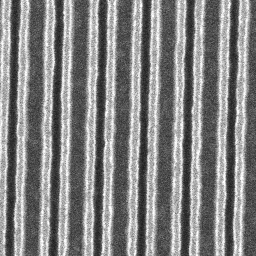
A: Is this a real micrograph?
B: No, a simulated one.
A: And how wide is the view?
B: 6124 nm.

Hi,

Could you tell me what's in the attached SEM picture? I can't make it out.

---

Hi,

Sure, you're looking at parallel lines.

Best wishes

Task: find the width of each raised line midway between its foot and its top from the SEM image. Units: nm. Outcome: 224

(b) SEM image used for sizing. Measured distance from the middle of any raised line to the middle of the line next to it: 521 nm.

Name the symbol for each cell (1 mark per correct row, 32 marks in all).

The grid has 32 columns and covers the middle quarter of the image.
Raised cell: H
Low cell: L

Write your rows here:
HHLLLLHHLLHHHLLLLHHLLLHLLLLLHHLL
HHLLLLHHHLHHHLLLLHHLLLHLLLLLHHLL
HLLLLLHHHLHHHLLLLHHLLHHHLLLLHHLL
HLLLLLHHLLHHHLLLLHHLLHHHLLLLHHLL
HLLLLLHHLLLHHLLLLHHLLHHHLLLLHHLL
HHLLLLHHLLLHHLLLLHHLLHHHLLLLHHLL
HLLLLLHHLLLHHLLLLHHLLHHHLLLLHHLL
HLLLLLHHLLLHHLLLLHHLLHHLLLLLHHLL
HHLLLLHHLLLHLLLLLHHLLHHLLLLLHHLL
HHLLLLHHLLHHLLLLLHHLLHHLLLLLHHLL
HHLLLLHHLLHHLLLLLHHLLHHLLLLLHHLL
HLLLLLHHLLHHHLLLLHHLLHHLLLLLHHLL
HLLLLLHHLLHHHLLLLHHLLHHLLLLLHHLL
HLLLLLHHLLHHLLLLLHHLLHHLLLLLHHLL
HLLLLLHHLLHHLLLLLHHLLHHLLLLLHHLL
HLLLLLHHLLHHLLLLLHHLLHHLLLLLHHLL
HLLLLLHHLLHHLLLLLHHLLHHLLLLLHHLL
HLLLLLHHLLHHLLLLLHHLLHHLLLLLHHLL
HLLLLLHHLLHHLLLLHHHLLHHLLLLHHHLL
HLLLLLHHLLHHLLLLHHHLLHHLLLLHHHLL
HLLLLLHHLLHHLLLLHHHLLHHLLLLHHHLL
HLLLLLHHLLHHLLLLLHHLLHHLLLLHHHLL
HLLLLLHHLLHHLLLLLHHLLHHLLLLHHHLL
HLLLLLHHLLHHLLLLLHHLLHHLLLLHHHLL
HLLLLLHHLLHHLLLLHHHLLHHLLLLHHHLL
HLLLLLHHLLHHLLLLHHHLLHHLLLLHHHLL
HLLLLHHHLLHHLLLLHHHLLHHLLLLLHHLL
HLLLLHHHLLHHLLLLHHHLLHHLLLLLHHLL
HLLLLHHHLLHHLLLLHHHLHHHLLLLHHHLL
HLLLLLHHLLHHLLLLHHLLLHHLLLLHHHLL
HLLLLLHLLLHHLLLLLHLLLHHLLLLHHHLH
HLLLLHHHLLHHLLLLHHLLLHHLLLLHHHLL